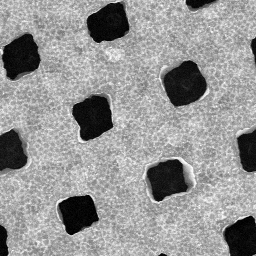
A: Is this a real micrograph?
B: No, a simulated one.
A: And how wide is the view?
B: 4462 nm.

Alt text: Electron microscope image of holes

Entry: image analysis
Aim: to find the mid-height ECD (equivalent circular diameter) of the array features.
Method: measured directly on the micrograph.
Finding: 727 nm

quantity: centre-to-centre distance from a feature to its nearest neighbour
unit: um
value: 1.66